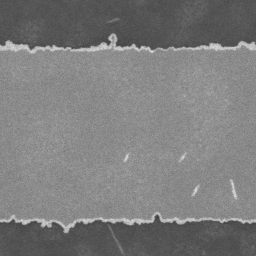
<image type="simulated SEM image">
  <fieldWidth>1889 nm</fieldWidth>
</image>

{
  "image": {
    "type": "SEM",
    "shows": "one or a few lines or trenches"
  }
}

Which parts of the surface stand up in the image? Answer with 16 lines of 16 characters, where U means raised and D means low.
DDDDDDDDDDDDDDDD
DDDDDDDDDDDDDDDD
DDDDDDDDDDDDDDDD
UUUUUUUUUUUUUUUU
UUUUUUUUUUUUUUUU
UUUUUUUUUUUUUUUU
UUUUUUUUUUUUUUUU
UUUUUUUUUUUUUUUU
UUUUUUUUUUUUUUUU
UUUUUUUUUUUUUUUU
UUUUUUUUUUUUUUUU
UUUUUUUUUUUUUUUU
UUUUUUUUUUUUUUUU
UUUUUUUUUUUUUUUU
DDDDDDDDDDDDDDDD
DDDDDDDDDDDDDDDD